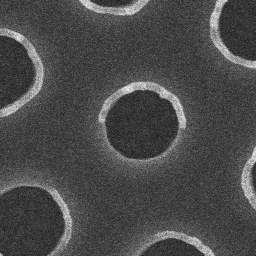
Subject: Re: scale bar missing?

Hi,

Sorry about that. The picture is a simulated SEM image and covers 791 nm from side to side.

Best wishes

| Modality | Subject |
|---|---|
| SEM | holes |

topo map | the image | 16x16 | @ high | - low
@@@@@@@@@@@@@@--
@@@@@@@@@@@@@@--
-@@@@@@@@@@@@@--
--@@@@@@@@@@@@@-
--@@@@@@@@@@@@@@
--@@@@@@@@@@@@@@
-@@@@@@----@@@@@
@@@@@@@----@@@@@
@@@@@@@----@@@@@
@@@@@@@---@@@@@@
@@@@@@@@@@@@@@@@
@@@@@@@@@@@@@@@@
---@@@@@@@@@@@@@
----@@@@@@@@@@@@
----@@@@@@@@@@@@
---@@@@@@---@@@@